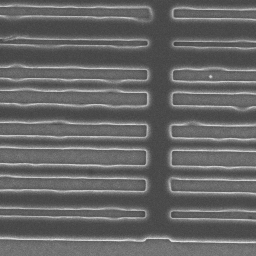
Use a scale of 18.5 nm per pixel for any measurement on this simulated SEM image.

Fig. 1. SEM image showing groups of lines, slits or small figures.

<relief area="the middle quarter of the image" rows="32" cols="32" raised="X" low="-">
XXXXXXXXXXXXXXXXXXXXXXXXXXXXXXXX
--------------------XXXXXXXX----
---------------------XXXXXX-----
---------------------XXXXXX-----
XXXXXXXXXXXX-XXXXXXXXXXXXXXXXX--
XXXXXXXXXXXXXXXXXXXXXXXXXXXXXXXX
XXXXXXXXXXXXXXXXXXXXXXXXXXXXXXXX
---------------------XXXXXX-----
---------------------XXXXXX-----
---------------------XXXXXX-----
XXXXXXXXXXX---------XXXXXXXX----
XXXXXXXXXXXXXXXXXXXXXXXXXXXXXXXX
XXXXXXXXXXXXXXXXXXXXXXXXXXXXXXXX
XXXXXXXXXXXXXXXXXXXXXXXXXXXXXXXX
XXXXXXXXXXXXXXXXXXXXXXXXXXXXXXXX
---------------------XXXXXX-----
---------------------XXXXXX-----
---------------------XXXXXX-----
XXXXXXXXXXXXXXXXXXXXXXXXXXXXXX--
XXXXXXXXXXXXXXXXXXXXXXXXXXXXXXXX
XXXXXXXXXXXXXXXXXXXXXXXXXXXXXXXX
--------------------XXXXXXXXXXXX
---------------------XXXXXX-----
---------------------XXXXXX-----
---------------------XXXXXX-----
XXXXXXXXXXXXXXXXXXXXXXXXXXX-XX--
XXXXXXXXXXXXXXXXXXXXXXXXXXXXXXXX
XXXXXXXXXXXXXXXXXXXXXXXXXXXXXXXX
------XXXXXXXXXXXXXXXXXXXXXXXXXX
--------------------XXXXXXX-----
---------------------XXXXXX-----
--------------------XXXXXXX-----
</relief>